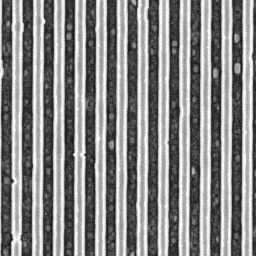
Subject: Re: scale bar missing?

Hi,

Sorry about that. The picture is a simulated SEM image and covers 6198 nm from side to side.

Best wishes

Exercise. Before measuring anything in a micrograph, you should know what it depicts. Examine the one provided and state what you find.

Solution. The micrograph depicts parallel lines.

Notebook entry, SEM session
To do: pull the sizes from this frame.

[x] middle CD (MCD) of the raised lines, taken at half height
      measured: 0.218 µm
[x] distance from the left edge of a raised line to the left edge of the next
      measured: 507 nanometers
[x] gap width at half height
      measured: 306 nanometres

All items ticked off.